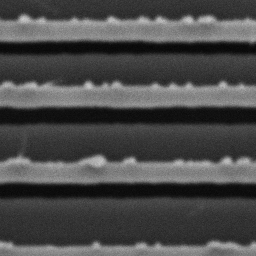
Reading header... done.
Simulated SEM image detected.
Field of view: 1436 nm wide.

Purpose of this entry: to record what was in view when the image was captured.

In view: lines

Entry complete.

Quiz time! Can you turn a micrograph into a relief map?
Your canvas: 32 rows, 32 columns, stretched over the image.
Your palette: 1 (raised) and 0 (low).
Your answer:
11111111111111111111111111111111
11111111111111111111111111111111
11111111111111111111111111111111
11111111111111111111111111111111
11111111111111111111111111111111
00000000000000000000000000000000
00000000000000000000000000000000
11111111111111111111111111111111
11111111111111111111111111111111
11111111111111111111111111111111
11111111111111111111111111111111
11111111111111111111111111111111
11111111111111111111111111111111
00000000000000000000000000000000
00000000000000000000000000000000
00000000000000000000000000000000
11111111111111111111111111111111
11111111111111111111111111111111
11111111111111111111111111111111
11111111111111111111111111111111
11111111111111111111111111111111
11111111111111111111111111111111
11111111111111111111111111111111
00000000000000000000000000000000
00000000000000000000000000000000
11111111111111111111111111111111
11111111111111111111111111111111
11111111111111111111111111111111
11111111111111111111111111111111
11111111111111111111111111111111
11111111111111111111111111111111
11111111111111111111111111111111